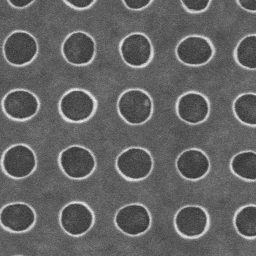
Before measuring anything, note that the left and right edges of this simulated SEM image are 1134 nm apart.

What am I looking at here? a regular array of holes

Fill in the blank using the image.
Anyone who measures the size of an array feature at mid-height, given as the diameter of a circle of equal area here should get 142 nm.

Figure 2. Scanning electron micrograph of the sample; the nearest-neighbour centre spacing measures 0.25 µm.